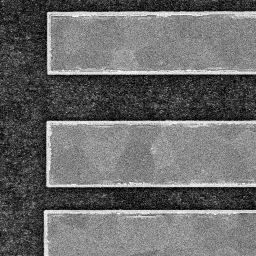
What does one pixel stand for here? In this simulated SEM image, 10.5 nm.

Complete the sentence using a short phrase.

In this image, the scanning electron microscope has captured one or a few lines or trenches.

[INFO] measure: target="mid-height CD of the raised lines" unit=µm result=0.647